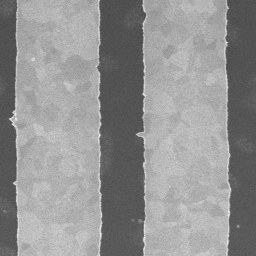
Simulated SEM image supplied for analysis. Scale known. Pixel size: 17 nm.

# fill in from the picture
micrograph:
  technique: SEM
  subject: one or a few lines or trenches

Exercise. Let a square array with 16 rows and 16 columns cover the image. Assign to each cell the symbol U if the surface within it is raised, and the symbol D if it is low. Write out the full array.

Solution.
DUUUUUDDDUUUUUDD
DUUUUUDDDUUUUUDD
DUUUUUDDDUUUUUDD
DUUUUUDDDUUUUUDD
DUUUUUDDDUUUUUDD
DUUUUUDDDUUUUUDD
DUUUUUDDDUUUUUDD
DUUUUUDDDUUUUUDD
DUUUUUDDDUUUUUDD
DUUUUUDDDUUUUUDD
DUUUUUUDDUUUUUDD
DUUUUUDDDUUUUUDD
DUUUUUDDDUUUUUDD
DUUUUUDDDUUUUUDD
DUUUUUDDDUUUUUDD
DUUUUUDDDUUUUUDD